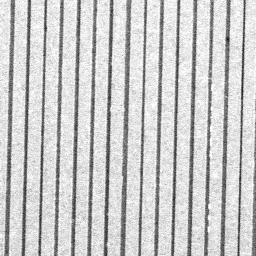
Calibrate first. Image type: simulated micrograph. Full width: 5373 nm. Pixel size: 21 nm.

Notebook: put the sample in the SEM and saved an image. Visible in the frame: parallel lines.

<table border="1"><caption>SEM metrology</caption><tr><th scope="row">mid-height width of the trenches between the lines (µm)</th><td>0.107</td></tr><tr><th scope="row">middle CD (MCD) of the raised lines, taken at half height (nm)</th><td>252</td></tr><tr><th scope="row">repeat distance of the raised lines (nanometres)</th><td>346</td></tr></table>